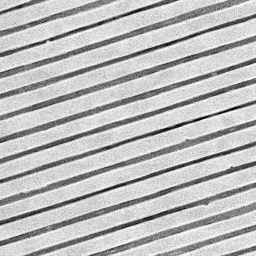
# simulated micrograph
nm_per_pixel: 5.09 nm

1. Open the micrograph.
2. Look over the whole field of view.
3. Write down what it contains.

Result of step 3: parallel lines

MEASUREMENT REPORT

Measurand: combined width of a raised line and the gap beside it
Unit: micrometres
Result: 0.102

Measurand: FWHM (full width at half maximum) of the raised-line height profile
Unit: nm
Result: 71.1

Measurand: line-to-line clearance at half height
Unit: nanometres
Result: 30.9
